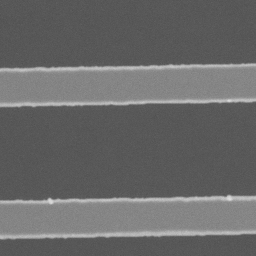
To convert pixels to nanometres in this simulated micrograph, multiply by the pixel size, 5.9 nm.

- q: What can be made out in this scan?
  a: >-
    lines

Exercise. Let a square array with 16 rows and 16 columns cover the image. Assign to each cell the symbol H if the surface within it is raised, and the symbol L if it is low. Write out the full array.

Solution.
LLLLLLLLLLLLLLLL
LLLLLLLLLLLLLLLL
LLLLLLLLLLLLLLLL
LLLLLLLLLLLLLLLL
HHHHHHHHHHHHHHHH
HHHHHHHHHHHHHHHH
HHHHHHHHLLLLLLLL
LLLLLLLLLLLLLLLL
LLLLLLLLLLLLLLLL
LLLLLLLLLLLLLLLL
LLLLLLLLLLLLLLLL
LLLLLLLLLLLLLLLL
LLLHHHHHHHHHHHHH
HHHHHHHHHHHHHHHH
HHHHHHHHHHHHHHHH
LLLLLLLLLLLLLLLL